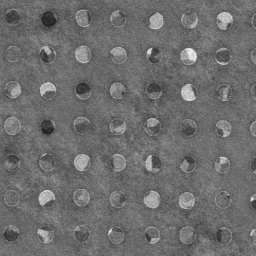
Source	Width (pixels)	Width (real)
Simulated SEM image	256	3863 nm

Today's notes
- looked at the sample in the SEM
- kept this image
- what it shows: a regular array of raised bodies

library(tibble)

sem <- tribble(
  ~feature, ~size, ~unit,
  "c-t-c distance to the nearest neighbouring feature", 524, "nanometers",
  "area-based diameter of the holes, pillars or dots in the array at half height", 240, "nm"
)